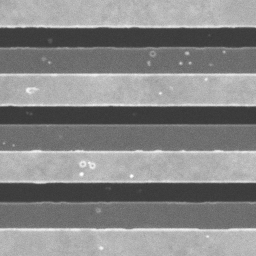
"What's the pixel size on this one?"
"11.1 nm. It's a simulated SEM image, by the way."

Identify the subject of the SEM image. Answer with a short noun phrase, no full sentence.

lines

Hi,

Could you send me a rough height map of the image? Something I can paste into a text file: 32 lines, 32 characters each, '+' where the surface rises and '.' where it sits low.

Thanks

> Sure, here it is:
++++++++++++++++++++++++++++++++
++++++++++++++++++++++++++++++++
++++++++++++++++++++++++++++++++
................................
................................
................................
++++++++++++++++++++++++++++++++
++++++++++++++++++++++++++++++++
++++++++++++++++++++++++++++++++
++++++++++++++++++++++++++++++++
++++++++++++++++++++++++++++++++
++++++++++++++++++++++++++++++++
++++++++++++++++++++++++++++++++
................................
................................
................................
++++++++++++++++++++++++++++++++
++++++++++++++++++++++++++++++++
++++++++++++++++++++++++++++++++
++++++++++++++++++++++++++++++++
++++++++++++++++++++++++++++++++
++++++++++++++++++++++++++++++++
++++++++++++++++++++++++++++++++
................................
................................
++++++++++++++++++++++++++++++++
++++++++++++++++++++++++++++++++
++++++++++++++++++++++++++++++++
++++++++++++++++++++++++++++++++
++++++++++++++++++++++++++++++++
++++++++++++++++++++++++++++++++
++++++++++++++++++++++++++++++++